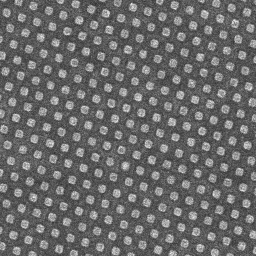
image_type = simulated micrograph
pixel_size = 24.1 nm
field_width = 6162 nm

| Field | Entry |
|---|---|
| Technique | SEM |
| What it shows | a regular array of raised bodies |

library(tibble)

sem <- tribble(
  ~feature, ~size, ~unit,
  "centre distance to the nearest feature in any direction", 375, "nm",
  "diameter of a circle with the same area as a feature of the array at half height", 188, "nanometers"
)